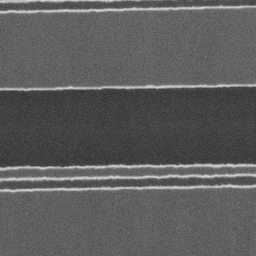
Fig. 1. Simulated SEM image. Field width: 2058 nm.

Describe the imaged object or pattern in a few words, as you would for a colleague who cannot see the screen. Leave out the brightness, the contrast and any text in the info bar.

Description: lines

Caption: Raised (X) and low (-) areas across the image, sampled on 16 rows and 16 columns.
XXXXXXXXXXXXXXXX
XXXXXXXXXXXXXXXX
XXXXXXXXXXXXXXXX
XXXXXXXXXXXXXXXX
XXXXXXXXXXXXXXXX
XXXX------------
----------------
----------------
----------------
----------------
----XXXXXXXXXXXX
XXXXXXXXXXXXXXXX
XXXXXXXXXXXXXXXX
XXXXXXXXXXXXXXXX
XXXXXXXXXXXXXXXX
XXXXXXXXXXXXXXXX